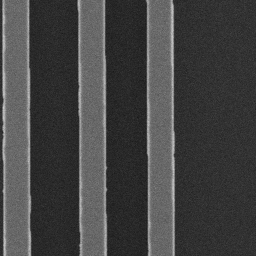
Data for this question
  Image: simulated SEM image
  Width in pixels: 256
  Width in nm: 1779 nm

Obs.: lines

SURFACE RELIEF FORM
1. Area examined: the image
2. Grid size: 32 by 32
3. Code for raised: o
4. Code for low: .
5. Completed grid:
oooo......ooo.....oooo..........
oooo......ooo.....oooo..........
oooo......ooo.....oooo..........
oooo......ooo.....oooo..........
oooo......ooo.....oooo..........
oooo......ooo.....oooo..........
oooo......ooo.....oooo..........
oooo......ooo.....oooo..........
oooo......ooo.....oooo..........
oooo......ooo.....oooo..........
oooo......ooo.....oooo..........
oooo......ooo.....oooo..........
.ooo......ooo.....oooo..........
oooo......ooo.....oooo..........
oooo......ooo.....oooo..........
.ooo......ooo.....oooo..........
oooo......ooo.....oooo..........
oooo......ooo.....oooo..........
oooo......ooo.....oooo..........
oooo......ooo.....oooo..........
.ooo......ooo......ooo..........
.ooo......ooo......ooo..........
.ooo......ooo......ooo..........
.ooo......ooo......ooo..........
.ooo......ooo......ooo..........
.ooo......ooo......ooo..........
.ooo......ooo......ooo..........
.ooo......ooo......ooo..........
.ooo......ooo......ooo..........
.ooo......ooo......ooo..........
.ooo......ooo......ooo..........
.ooo......ooo......ooo..........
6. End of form